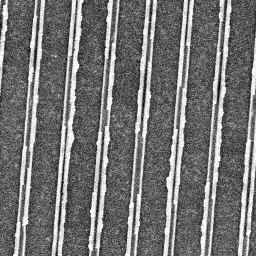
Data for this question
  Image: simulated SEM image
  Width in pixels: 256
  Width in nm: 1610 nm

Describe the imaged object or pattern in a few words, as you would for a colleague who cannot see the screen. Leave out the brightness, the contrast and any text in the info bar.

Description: parallel lines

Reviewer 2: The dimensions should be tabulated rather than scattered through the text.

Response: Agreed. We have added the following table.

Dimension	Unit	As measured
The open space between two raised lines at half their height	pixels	27.4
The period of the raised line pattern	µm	0.234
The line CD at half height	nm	62.6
